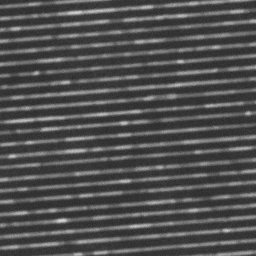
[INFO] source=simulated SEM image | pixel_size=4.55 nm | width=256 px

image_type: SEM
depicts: parallel lines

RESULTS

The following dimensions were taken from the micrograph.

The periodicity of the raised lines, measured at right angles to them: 52.2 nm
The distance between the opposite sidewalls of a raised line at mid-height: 11.3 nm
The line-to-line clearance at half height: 0.0403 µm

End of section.